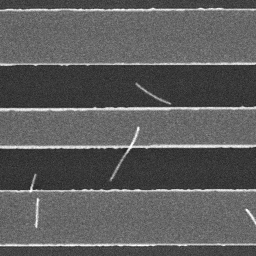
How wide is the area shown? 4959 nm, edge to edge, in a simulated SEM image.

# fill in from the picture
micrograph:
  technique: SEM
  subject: lines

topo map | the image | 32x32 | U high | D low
DDDDDDDDDDDDDDDDDDDDDDDDDDDDDDDD
UUUUUUUUUUUUUUUUUUUUUUUUUUUUUUUU
UUUUUUUUUUUUUUUUUUUUUUUUUUUUUUUU
UUUUUUUUUUUUUUUUUUUUUUUUUUUUUUUU
UUUUUUUUUUUUUUUUUUUUUUUUUUUUUUUU
UUUUUUUUUUUUUUUUUUUUUUUUUUUUUUUU
UUUUUUUUUUUUUUUUUUUUUUUUUUUUUUUU
UUUUUUUUUUUUUUUUUUUUUUUUUUUUUUUU
DDDDDDDDDDDDDDDDDDDDDDDDDDDDDDDD
DDDDDDDDDDDDDDDDDDDDDDDDDDDDDDDD
DDDDDDDDDDDDDDDDDDDDDDDDDDDDDDDD
DDDDDDDDDDDDDDDDDDDDDDDDDDDDDDDD
DDDDDDDDDDDDDDDDDDDDDDDDDDDDDDDD
DDDDDDDDDDDDDDDDDDDDDUUDUUUUUUUU
UUUUUUUUUUUUUUUUUUUUUUUUUUUUUUUU
UUUUUUUUUUUUUUUUUUUUUUUUUUUUUUUU
UUUUUUUUUUUUUUUUUUUUUUUUUUUUUUUU
UUUUUUUUUUUUUUUUUUUUUUUUUUUUUUUU
DDDDUUDDDDDDDDDDUDDDDDDDDDDDDDDD
DDDDDDDDDDDDDDDDDDDDDDDDDDDDDDDD
DDDDDDDDDDDDDDDDDDDDDDDDDDDDDDDD
DDDDDDDDDDDDDDDDDDDDDDDDDDDDDDDD
DDDDDDDDDDDDDDDDDDDDDDDDDDDDDDDD
DDDDDDDDDDDDDDDDDDDDDDDDDDDDDDDD
UUUUUUUUUUUUUUUUUUUUUUUUUUUUUUUU
UUUUUUUUUUUUUUUUUUUUUUUUUUUUUUUU
UUUUUUUUUUUUUUUUUUUUUUUUUUUUUUUU
UUUUUUUUUUUUUUUUUUUUUUUUUUUUUUUU
UUUUUUUUUUUUUUUUUUUUUUUUUUUUUUUU
UUUUUUUUUUUUUUUUUUUUUUUUUUUUUUUU
UUUUUUUUUUUUUUUUUUUUUUUUUUUUUUUU
DDDDDDDDDDDDDDDDDDDDDDDDDDDDDDDD